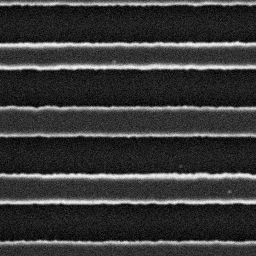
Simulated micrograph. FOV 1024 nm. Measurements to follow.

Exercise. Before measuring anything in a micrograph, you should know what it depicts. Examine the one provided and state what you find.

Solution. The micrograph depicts lines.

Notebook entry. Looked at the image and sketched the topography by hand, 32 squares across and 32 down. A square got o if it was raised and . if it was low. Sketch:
oooooooooooooooooooooooooooooooo
................................
................................
................................
................................
..........o...ooo..ooo.o....oo.o
oooooooooooooooooooooooooooooooo
oooooooooooooooooooooooooooooooo
ooo.oooo.o.ooo...oo......oooo.oo
................................
................................
................................
................................
oooo.oooooooooooooooooooooooo.oo
oooooooooooooooooooooooooooooooo
oooooooooooooooooooooooooooooooo
oooooooooooooooooooooooooooooooo
................................
................................
................................
................................
................................
oooooooooooooooooooooooooooooooo
oooooooooooooooooooooooooooooooo
oooooooooooooooooooooooooooooooo
................................
................................
................................
................................
................................
oooooooooooooooooooooooooooooooo
oooooooooooooooooooooooooooooooo